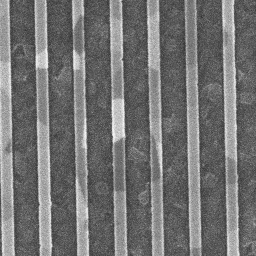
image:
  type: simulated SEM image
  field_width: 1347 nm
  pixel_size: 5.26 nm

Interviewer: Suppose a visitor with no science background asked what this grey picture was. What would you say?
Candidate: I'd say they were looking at parallel lines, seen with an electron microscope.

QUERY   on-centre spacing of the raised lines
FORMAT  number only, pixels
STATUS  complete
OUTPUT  37.5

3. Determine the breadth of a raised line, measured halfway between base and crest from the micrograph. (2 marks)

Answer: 57.2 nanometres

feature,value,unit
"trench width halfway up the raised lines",140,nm